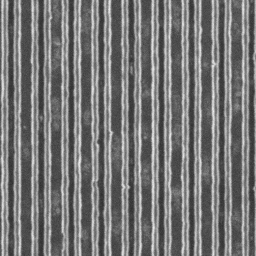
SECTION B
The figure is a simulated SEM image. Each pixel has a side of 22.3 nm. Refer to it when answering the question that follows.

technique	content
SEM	parallel lines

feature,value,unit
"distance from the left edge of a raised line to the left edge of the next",336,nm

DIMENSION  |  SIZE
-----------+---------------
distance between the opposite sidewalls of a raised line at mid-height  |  117 nanometers